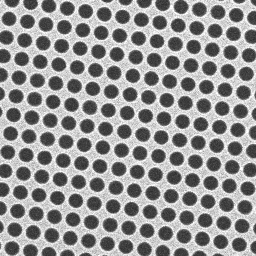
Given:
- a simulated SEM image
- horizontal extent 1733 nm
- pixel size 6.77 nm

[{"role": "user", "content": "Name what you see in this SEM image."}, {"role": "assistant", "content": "a regular array of holes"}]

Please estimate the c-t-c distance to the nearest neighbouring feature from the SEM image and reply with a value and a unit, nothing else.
126 nm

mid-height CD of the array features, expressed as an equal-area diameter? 13.6 pixels